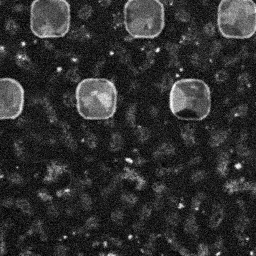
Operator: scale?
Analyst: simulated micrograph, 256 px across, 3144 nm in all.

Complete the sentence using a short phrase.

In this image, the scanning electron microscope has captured raised bodies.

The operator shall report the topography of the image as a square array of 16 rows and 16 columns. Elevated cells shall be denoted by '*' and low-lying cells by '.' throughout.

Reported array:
..**....**....**
..**....**....**
................
................
................
*....**....**...
*....**....**...
................
................
................
................
................
................
................
................
................